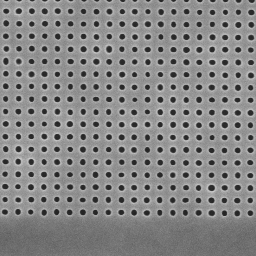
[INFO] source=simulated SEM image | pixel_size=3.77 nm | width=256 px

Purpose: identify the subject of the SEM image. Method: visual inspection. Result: a regular array of holes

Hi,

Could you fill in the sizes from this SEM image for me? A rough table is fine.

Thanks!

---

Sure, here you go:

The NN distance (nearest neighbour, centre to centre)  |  0.0461 µm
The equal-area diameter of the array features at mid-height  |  20.9 nanometers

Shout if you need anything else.